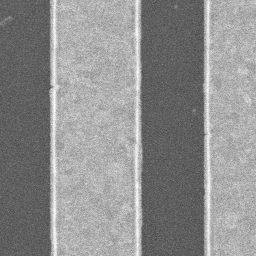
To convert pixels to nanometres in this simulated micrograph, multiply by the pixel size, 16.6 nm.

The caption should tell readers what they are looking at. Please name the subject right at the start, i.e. one or a few lines or trenches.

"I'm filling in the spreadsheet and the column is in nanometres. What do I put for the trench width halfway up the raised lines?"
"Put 1190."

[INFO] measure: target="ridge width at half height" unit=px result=82.1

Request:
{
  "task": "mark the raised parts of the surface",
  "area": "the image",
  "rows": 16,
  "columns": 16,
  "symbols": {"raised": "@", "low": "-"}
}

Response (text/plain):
---@@@@@@----@@@
---@@@@@@----@@@
---@@@@@@----@@@
---@@@@@@----@@@
---@@@@@@----@@@
---@@@@@@----@@@
---@@@@@@----@@@
---@@@@@@----@@@
---@@@@@@----@@@
---@@@@@@----@@@
---@@@@@-----@@@
---@@@@@@----@@@
---@@@@@@----@@@
---@@@@@@----@@@
---@@@@@@----@@@
---@@@@@@----@@@